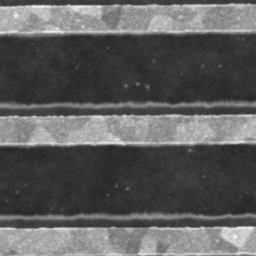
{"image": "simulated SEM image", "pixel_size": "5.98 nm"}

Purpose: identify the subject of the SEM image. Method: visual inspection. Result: lines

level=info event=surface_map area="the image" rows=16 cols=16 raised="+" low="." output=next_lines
++++++++++++++++
++++++++++++++++
................
................
................
................
................
++++++++++++++++
++++++++++++++++
................
................
................
................
..............++
++++++++++++++++
++++++++++++++++